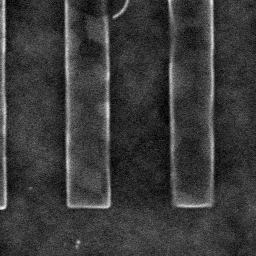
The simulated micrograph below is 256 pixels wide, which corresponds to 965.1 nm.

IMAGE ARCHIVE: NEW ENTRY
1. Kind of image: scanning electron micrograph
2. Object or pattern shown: wiring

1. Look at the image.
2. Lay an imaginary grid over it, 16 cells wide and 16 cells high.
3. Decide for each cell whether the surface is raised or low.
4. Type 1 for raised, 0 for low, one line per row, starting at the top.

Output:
0000111000011000
0000111000011000
0000111000011000
0000111000011000
0000111000011000
0000111000011000
0000111000011000
0000111000011000
0000111000011000
0000111000011000
0000111000011000
0000111000011000
0000111000011000
0000000000000000
0000000000000000
0000000000000000